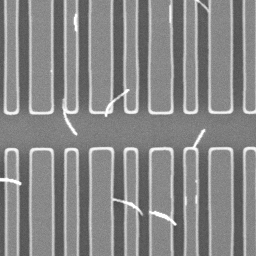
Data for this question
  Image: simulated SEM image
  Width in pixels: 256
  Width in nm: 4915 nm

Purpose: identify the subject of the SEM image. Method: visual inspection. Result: groups of lines, slits or small figures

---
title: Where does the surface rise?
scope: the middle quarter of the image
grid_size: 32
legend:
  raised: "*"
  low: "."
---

***....*****...***...******...**
***....*****...***...******...**
***....*****...***...******...**
***....*****...***...******...**
***....*****...***...******...**
***....*****...***...******...**
***....*****...***....*****...**
***....*****...***....*****...**
***....*****...***....*****...**
***....*****...***....*****...**
***....*****...***....*****...**
***....*****...***....*****...**
..........*.....................
................................
................................
................................
................................
................................
................................
................................
................................
.**....*****...***....*****...**
***....*****...***....*****...**
***....*****...***....*****...**
***....*****...***....*****...**
***....*****...***....*****...**
***....*****...***....*****...**
***....*****...***....*****...**
***....*****...***....*****...**
***....*****...***....*****...**
***....*****...***....*****...**
***....*****...***....*****...**